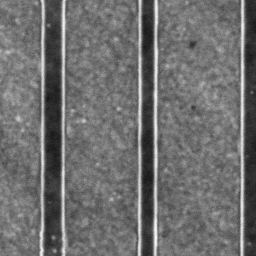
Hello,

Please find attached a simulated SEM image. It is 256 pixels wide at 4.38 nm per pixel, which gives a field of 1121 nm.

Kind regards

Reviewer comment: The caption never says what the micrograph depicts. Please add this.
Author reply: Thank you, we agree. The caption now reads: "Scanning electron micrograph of one or a few lines or trenches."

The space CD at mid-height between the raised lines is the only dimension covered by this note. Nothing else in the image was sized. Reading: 0.351 micrometres